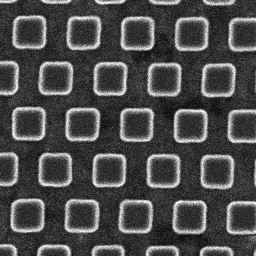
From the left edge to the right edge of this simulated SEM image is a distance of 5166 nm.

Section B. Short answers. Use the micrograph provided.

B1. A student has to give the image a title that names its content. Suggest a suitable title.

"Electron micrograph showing a regular array of raised bodies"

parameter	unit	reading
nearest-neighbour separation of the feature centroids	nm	1070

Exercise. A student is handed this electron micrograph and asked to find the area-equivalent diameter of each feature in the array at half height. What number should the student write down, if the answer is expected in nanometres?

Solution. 695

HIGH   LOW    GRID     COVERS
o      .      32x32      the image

................................
................................
..ooo....ooo....ooo....ooo...ooo
..oooo...oooo..oooo...oooo...ooo
..oooo...ooo...oooo...oooo...ooo
..oooo...ooo...oooo...oooo...ooo
................................
................................
oo...oooo...oooo...ooo....ooo...
oo...oooo...oooo...oooo..oooo...
oo...oooo...oooo...ooo...oooo...
oo...ooo....ooo....ooo....ooo...
................................
................................
..oooo..oooo...oooo...oooo...ooo
..ooo...oooo...oooo...oooo...ooo
..ooo...oooo...oooo...oooo...ooo
................oo....ooo....ooo
................................
oo...ooo....ooo.....oo..........
oo...oooo...oooo...ooo...oooo...
oo...oooo...oooo...ooo...oooo...
oo...oooo...oooo...ooo...oooo...
................................
................................
..ooo....ooo...oooo...ooo....ooo
..ooo...oooo...oooo...oooo...ooo
..ooo...oooo...oooo...oooo...ooo
..ooo...oooo...oooo...oooo...ooo
................................
................................
oo...oooo...ooo...oooo...oooo...